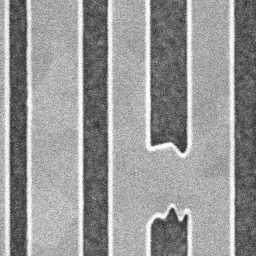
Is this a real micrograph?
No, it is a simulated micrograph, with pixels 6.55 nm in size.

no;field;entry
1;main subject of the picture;one or a few lines or trenches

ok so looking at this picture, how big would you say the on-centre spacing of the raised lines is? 0.509 microns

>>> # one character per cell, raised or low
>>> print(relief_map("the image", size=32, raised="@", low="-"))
@---@@@@@@----@@@@------@@@@@---
@---@@@@@@----@@@@------@@@@@---
@---@@@@@@----@@@@------@@@@@---
@---@@@@@@----@@@@------@@@@@---
@---@@@@@@----@@@@------@@@@@---
@---@@@@@@----@@@@------@@@@@---
@---@@@@@@----@@@@------@@@@@---
@---@@@@@@----@@@@------@@@@@---
@---@@@@@@----@@@@------@@@@@---
@---@@@@@@----@@@@------@@@@@---
@---@@@@@@----@@@@------@@@@@---
@---@@@@@@----@@@@------@@@@@---
@---@@@@@@----@@@@------@@@@@---
@---@@@@@@----@@@@------@@@@@---
@---@@@@@@----@@@@------@@@@@---
@---@@@@@@----@@@@------@@@@@---
@---@@@@@@----@@@@------@@@@@---
@---@@@@@@----@@@@------@@@@@---
@---@@@@@@----@@@@@@@@--@@@@@---
@---@@@@@@----@@@@@@@@@@@@@@@---
@---@@@@@@----@@@@@@@@@@@@@@@---
@---@@@@@@----@@@@@@@@@@@@@@@---
@---@@@@@@----@@@@@@@@@@@@@@@---
@---@@@@@@----@@@@@@@@@@@@@@@---
@---@@@@@@----@@@@@@@@@@@@@@@---
@---@@@@@@----@@@@@@@@@@@@@@@---
@---@@@@@@----@@@@@@@-@@@@@@@---
@---@@@@@@----@@@@@-----@@@@@---
@---@@@@@@----@@@@@-----@@@@@---
@---@@@@@@----@@@@------@@@@@---
@---@@@@@@----@@@@------@@@@@---
@---@@@@@@----@@@@@-----@@@@@---